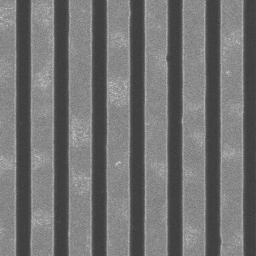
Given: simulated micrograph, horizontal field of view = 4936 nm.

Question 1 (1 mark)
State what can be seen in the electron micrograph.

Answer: parallel lines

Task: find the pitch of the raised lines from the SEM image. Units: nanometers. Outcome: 730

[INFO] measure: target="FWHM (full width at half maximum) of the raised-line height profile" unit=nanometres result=487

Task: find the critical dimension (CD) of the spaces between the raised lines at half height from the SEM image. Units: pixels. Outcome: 12.6